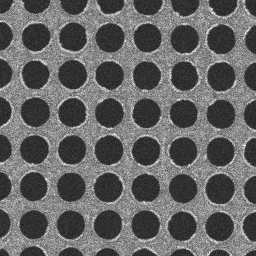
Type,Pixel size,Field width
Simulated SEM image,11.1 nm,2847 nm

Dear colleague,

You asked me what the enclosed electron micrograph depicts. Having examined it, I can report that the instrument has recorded a regular array of holes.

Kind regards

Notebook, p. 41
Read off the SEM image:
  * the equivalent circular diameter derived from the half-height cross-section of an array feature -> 318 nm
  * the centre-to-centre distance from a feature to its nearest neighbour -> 412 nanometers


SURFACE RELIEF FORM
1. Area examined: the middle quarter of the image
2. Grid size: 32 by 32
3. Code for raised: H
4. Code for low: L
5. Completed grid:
LLLLLHHHHLLLLLHHHHLLLLLHHHHHLLLL
LLLLLHHHLLLLLLLHHHLLLLLLHHHLLLLL
LLLLLLHHLLLLLLLHHLLLLLLLHHHLLLLL
LLLLLLHHLLLLLLLHHLLLLLLLHHHLLLLL
LLLLLHHHLLLLLLLHHLLLLLLLHHHLLLLL
LLLLHHHHHLLLLLHHHHLLLLLHHHHHLLLL
HHHHHHHHHHHHHHHHHHHHHHHHHHHHHLLH
HHHHHHHHHHHHHHHHHHHHHHHHHHHHHHHH
HHLHHHHHHHHHHHHHHHHHHHHHHHHHHHHH
LLLLHHHHHLLLLLHHHHLLLLLHHHHHLLLL
LLLLLHHHLLLLLLLHHHLLLLLLHHHLLLLL
LLLLLHHHLLLLLLLHHLLLLLLLHHLLLLLL
LLLLLHHHLLLLLLLHHLLLLLLLHHLLLLLL
LLLLLHHHLLLLLLLHHLLLLLLLHHLLLLLL
LLLLLHHHHLLLLLHHHHLLLLLLHHHLLLLL
HLLHHHHHHHLLLHHHHHHLLLLHHHHHLLLL
HHHHHHHHHHHHHHHHHHHHHHHHHHHHHHHH
HHHHHHHHHHHHHHHHHHHHHHHHHHHHHHHH
LLLLHHHHHLLLLHHHHHHLLLHHHHHHHLLH
LLLLLHHHLLLLLLHHHHLLLLLHHHHLLLLL
LLLLLHHHLLLLLLLHHLLLLLLLHHHLLLLL
LLLLLLHHLLLLLLLHHLLLLLLLHHLLLLLL
LLLLLHHHLLLLLLLHHLLLLLLLHHLLLLLL
LLLLLHHHLLLLLLHHHLLLLLLLHHHLLLLL
LLLLHHHHHLLLLHHHHHLLLLLHHHHLLLLL
HHHHHHHHHHHHHHHHHHHHHHHHHHHHHLHH
HHHHHHHHHHHHHHHHHHHHHHHHHHHHHHHH
LLLLHHHHHHLLHHHHHHHHLHHHHHHHHHHH
LLLLLHHHLLLLLLHHHHLLLLLHHHHLLLLL
LLLLLHHHLLLLLLHHHLLLLLLLHHHLLLLL
LLLLLHHLLLLLLLLHHLLLLLLLHHLLLLLL
LLLLLHHLLLLLLLHHHLLLLLLLHHLLLLLL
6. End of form